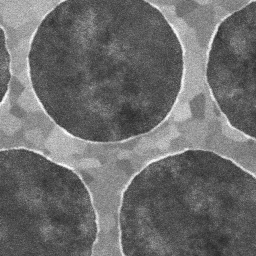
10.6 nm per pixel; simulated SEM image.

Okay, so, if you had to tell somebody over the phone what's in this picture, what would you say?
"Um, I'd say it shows holes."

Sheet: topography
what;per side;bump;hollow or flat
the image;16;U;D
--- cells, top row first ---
UUUDDDDDDDUUUUUD
UUUDDDDDDDDUUUDD
UUDDDDDDDDDUUDDD
UUDDDDDDDDDUUDDD
DUDDDDDDDDDUUDDD
UUDDDDDDDDDUUDDD
UUUDDDDDDDDUUUDD
UUUDDDDDDDUUUUDD
UUUUUDDDDUUUUUUU
DDUUUUUUUUUDDUUU
DDDDUUUUUDDDDDDU
DDDDDUUUDDDDDDDD
DDDDDDUUDDDDDDDD
DDDDDDUDDDDDDDDD
DDDDDDUUDDDDDDDD
DDDDDDUUDDDDDDDD